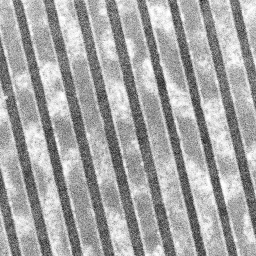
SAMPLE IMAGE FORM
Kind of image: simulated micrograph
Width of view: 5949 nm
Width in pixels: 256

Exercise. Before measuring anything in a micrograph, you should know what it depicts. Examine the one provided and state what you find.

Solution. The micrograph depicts parallel lines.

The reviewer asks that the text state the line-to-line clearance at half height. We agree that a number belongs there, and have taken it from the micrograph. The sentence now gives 277 nanometres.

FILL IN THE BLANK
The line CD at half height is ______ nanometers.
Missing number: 446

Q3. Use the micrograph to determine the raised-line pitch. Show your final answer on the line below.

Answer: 700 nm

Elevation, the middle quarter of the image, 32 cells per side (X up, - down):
--XXXX---XXXXX---XXXXX---XXXXX--
--XXXX---XXXXX---XXXXX---XXXXX--
--XXXXX---XXXX---XXXXX---XXXXX--
--XXXXX---XXXXX---XXXXX--XXXXX--
---XXXX---XXXXX---XXXXX--XXXXXX-
---XXXX---XXXXX---XXXXX---XXXXX-
---XXXXX---XXXX---XXXXX---XXXXX-
---XXXXX---XXXXX---XXXXX--XXXXX-
----XXXX---XXXXX---XXXXX--XXXXXX
X---XXXX---XXXXX---XXXXX---XXXXX
X---XXXX----XXXX---XXXXX---XXXXX
X---XXXXX---XXXX----XXXXX--XXXXX
X----XXXX---XXXXX---XXXXX--XXXXX
XX---XXXX---XXXXX---XXXXX---XXXX
XX---XXXXX---XXXX---XXXXX---XXXX
XX---XXXXX---XXXX----XXXX---XXXX
XX---XXXXX---XXXXX---XXXXX--XXXX
XXX---XXXX---XXXXX---XXXXX---XXX
XXX---XXXX----XXXX---XXXXX---XXX
XXX---XXXXX---XXXX----XXXX---XXX
XXX---XXXXX---XXXXX---XXXXX--XXX
XXXX---XXXX---XXXXX---XXXXX---XX
XXXX---XXXX---XXXXX---XXXXX---XX
XXXX---XXXXX---XXXX---XXXXX---XX
XXXX---XXXXX---XXXXX---XXXXX--XX
XXXX----XXXX---XXXXX---XXXXX---X
XXXXX---XXXX---XXXXX---XXXXX---X
XXXXX---XXXXX---XXXX---XXXXX---X
XXXXX---XXXXX---XXXXX---XXXXX--X
-XXXX----XXXX---XXXXX---XXXXX--X
-XXXXX---XXXX---XXXXX---XXXXX---
-XXXXX---XXXX----XXXX---XXXXX---